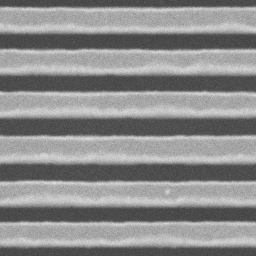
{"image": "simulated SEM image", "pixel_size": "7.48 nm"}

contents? lines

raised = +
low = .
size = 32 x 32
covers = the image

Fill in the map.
................................
++++++++++++++++++++++++++++++++
++++++++++++++++++++++++++++++++
++++++++++++++++++++++++++++++++
................................
................................
++++++++++++++++++++++++++++++++
++++++++++++++++++++++++++++++++
++++++++++++++++++++++++++++++++
................................
................................
................................
++++++++++++++++++++++++++++++++
++++++++++++++++++++++++++++++++
++++++++++++++++++++++++++++++++
................................
................................
++++++++++++++++++++++++++++++++
++++++++++++++++++++++++++++++++
++++++++++++++++++++++++++++++++
................................
................................
................................
++++++++++++++++++++++++++++++++
++++++++++++++++++++++++++++++++
++++++++++++++++++++++++++++++++
................................
................................
++++++++++++++++++++++++++++++++
++++++++++++++++++++++++++++++++
++++++++++++++++++++++++++++++++
................................